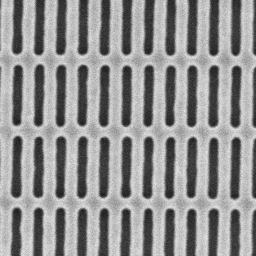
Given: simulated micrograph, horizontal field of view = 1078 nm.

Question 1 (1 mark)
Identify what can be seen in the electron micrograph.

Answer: a regular array of holes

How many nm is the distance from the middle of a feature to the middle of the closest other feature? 91.3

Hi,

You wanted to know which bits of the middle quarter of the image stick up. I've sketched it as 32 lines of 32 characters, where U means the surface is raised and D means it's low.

UUUUDDUUUUDUUUUDUUUUUDUUUUDUUUUU
DUUDDDUUUDDDUUDDDUUUDDDUUDDDUUUD
DUUDDDUUUDDUUUDDDUUUDDDUUDDDUUUD
DUUDDDUUUDDDUUDDDUUUDDDUUDDDUUUD
DUUDDDUUUDDDUUDDDUUUDDDUUDDDUUUD
DUUUDDUUUDDUUUDDDUUUDDDUUDDDUUUD
DUUDDDUUUDDUUUDDDUUUDDDUUDDDUUUD
DUUDDDUUUDDUUUDDDUUUDDDUUDDDUUUD
UUUDDDUUUDDUUUDDDUUUDDDUUDDDUUUD
UUUDDDUUUDDUUUDDDUUUDDUUUDDDUUUD
UUUDDDUUUDDUUUDDDUUUDDUUUDDDUUUD
UUUDDDUUUDDUUUUDDUUUDDUUUDDDUUUD
UUUDDDUUUDDUUUDDDUUUDDUUUDDDUUUD
UUUDDDUUUDDUUUDDDUUUDDUUUDDDUUUD
UUUDDDUUUDDUUUDDDUUUDDUUUDDDUUUD
UUUUDUUUUDDUUUUDUUUUDDUUUUDUUUUD
UUUUUUUUUUUUUUUUUUUUUUUUUUUUUUUU
UUUUUUUUUUUUUUUUUUUUUUUUUUUUUUUU
UUUUDDUUUDDUUUUDDUUUDDUUUUDDUUUU
DUUDDDUUUDDUUUDDDUUUDDUUUUDDUUUD
DUUDDDUUUDDUUUDDDUUUDDUUUDDDUUUD
DUUDDDUUUDDUUUDDDUUUDDUUUDDDUUUD
DUUDDDUUUDDUUUDDDUUUDDUUUDDDUUUD
DUUDDDUUUDDUUUDDDUUUDDUUUDDDUUUD
DUUDDDUUUDDUUUDDDUUUDDUUUDDDUUUD
DUUDDDUUUDDUUUDDDUUUDDUUUDDDUUUD
DUUDDDUUUDDUUUDDDUUUDDUUUDDDUUUD
UUUDDDUUUDDUUUDDDUUUDDUUUDDDUUUD
UUUDDDUUDDDUUUDDDUUUDDUUUDDUUUUD
UUUDDDUUDDDUUUDDDUUUDDUUUDDUUUUD
UUUDDDUUUDDUUUDDDUUUDDUUUDDUUUUD
UUUDDDUUUDDUUUDDDUUUDDUUUDDDUUUD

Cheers